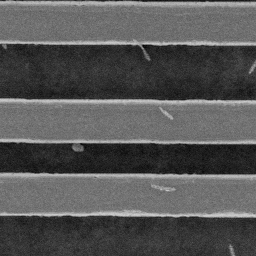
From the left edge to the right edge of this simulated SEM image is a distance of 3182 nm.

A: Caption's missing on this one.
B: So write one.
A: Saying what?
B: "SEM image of lines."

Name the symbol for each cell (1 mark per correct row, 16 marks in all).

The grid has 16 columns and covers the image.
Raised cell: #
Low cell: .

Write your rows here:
################
################
################
................
................
................
################
################
################
................
................
################
################
...............#
................
................